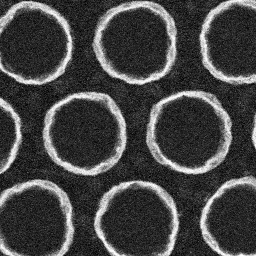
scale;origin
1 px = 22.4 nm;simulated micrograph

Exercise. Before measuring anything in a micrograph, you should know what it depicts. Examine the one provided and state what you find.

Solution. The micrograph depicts raised bodies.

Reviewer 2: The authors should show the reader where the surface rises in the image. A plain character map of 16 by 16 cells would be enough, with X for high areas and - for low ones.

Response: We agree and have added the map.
-XX-----XX----XX
XXXX--XXXXX--XXX
XXXX--XXXXX--XXX
XXXX--XXXXX--XXX
XXXX---XXX---XXX
----------------
----XXX---XXX---
X--XXXXX--XXXX--
X--XXXXX-XXXXX--
X--XXXX---XXXX--
----XX-----XX---
--------X-----XX
XXXX---XXX---XXX
XXXX--XXXXX--XXX
XXXX--XXXXX--XXX
XXXX---XXXX---XX